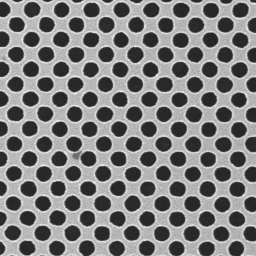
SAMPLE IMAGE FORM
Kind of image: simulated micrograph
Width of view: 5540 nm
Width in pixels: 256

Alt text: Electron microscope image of a regular array of holes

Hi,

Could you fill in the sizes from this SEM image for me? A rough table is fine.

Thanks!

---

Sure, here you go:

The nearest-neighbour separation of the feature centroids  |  449 nm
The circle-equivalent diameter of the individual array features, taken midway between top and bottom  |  347 nm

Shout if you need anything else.